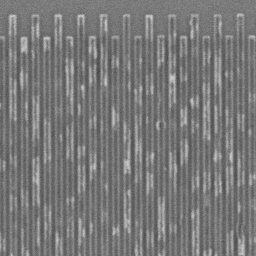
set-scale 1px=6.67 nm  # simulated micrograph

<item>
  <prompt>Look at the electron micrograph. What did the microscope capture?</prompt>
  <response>parallel lines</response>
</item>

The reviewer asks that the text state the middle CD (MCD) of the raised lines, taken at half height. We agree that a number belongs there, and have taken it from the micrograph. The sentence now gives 41.7 nanometres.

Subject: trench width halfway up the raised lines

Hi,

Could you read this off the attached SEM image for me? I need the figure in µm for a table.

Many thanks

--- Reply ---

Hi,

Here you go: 0.0325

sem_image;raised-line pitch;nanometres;75.9